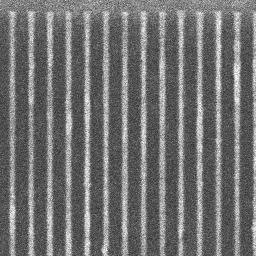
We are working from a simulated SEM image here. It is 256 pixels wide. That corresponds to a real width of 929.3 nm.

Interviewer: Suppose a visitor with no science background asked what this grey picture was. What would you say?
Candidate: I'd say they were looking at parallel lines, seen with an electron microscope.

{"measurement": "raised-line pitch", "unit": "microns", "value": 0.068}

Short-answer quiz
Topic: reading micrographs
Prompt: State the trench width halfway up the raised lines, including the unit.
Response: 47.2 nm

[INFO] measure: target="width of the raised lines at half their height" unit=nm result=20